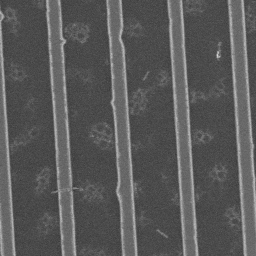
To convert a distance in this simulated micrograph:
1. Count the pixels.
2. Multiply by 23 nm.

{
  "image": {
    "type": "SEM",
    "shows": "parallel lines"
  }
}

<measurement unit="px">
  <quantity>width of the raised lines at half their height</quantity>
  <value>12.5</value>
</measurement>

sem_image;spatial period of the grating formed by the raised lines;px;60.7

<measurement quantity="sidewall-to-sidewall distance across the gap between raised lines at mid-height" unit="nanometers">1130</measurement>